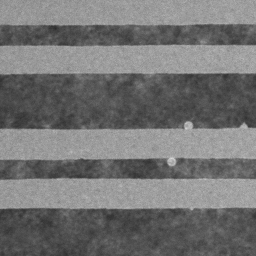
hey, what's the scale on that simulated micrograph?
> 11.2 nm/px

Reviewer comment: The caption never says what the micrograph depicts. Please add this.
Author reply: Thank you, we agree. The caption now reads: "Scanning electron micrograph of one or a few lines or trenches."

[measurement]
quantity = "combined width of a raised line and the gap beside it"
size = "752 nanometres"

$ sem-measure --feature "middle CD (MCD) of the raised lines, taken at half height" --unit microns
0.325